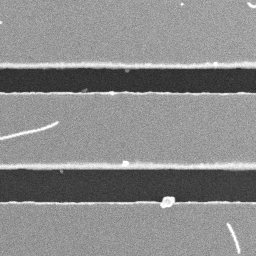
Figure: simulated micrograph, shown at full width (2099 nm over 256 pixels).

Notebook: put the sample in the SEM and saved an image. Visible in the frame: lines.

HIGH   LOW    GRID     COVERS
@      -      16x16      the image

@@@@@@@@@@@@@@@@
@@@@@@@@@@@@@@@@
@@@@@@@@@@@@@@@@
@@@@@@@@@@@@@@@@
----------------
----------------
@@@@@@@@@@@@@@@@
@@@@@@@@@@@@@@@@
@@@@@@@@@@@@@@@@
@@@@@@@@@@@@@@@@
--@---@@---@@@-@
----------------
----------@-----
@@@@@@@@@@@@@@@@
@@@@@@@@@@@@@@@@
@@@@@@@@@@@@@@@@